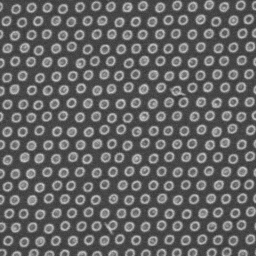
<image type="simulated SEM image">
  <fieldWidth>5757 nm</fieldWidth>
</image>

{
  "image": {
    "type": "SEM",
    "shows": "a regular array of raised bodies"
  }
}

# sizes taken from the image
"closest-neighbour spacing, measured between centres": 0.33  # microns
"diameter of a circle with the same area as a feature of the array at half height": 0.188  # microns